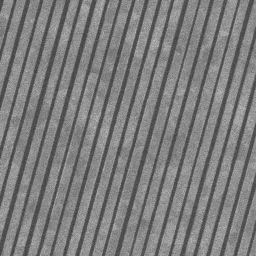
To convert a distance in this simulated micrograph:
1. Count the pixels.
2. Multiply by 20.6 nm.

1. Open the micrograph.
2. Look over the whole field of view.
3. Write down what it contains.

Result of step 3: parallel lines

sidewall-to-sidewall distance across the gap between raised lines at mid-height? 84.2 nm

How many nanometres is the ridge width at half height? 168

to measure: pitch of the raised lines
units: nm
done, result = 260